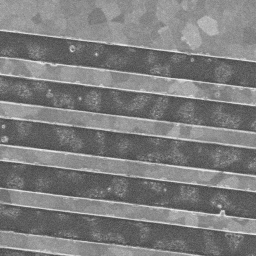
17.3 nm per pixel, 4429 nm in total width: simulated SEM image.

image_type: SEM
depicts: parallel lines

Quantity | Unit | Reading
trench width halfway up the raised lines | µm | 0.481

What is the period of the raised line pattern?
743 nm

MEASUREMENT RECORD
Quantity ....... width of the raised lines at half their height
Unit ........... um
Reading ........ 0.258